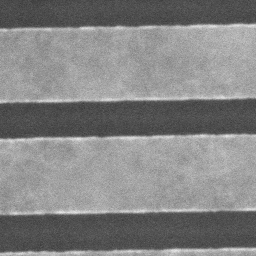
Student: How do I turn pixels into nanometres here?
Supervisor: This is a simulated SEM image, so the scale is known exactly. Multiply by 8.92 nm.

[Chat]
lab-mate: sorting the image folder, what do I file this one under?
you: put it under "lines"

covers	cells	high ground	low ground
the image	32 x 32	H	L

LLLLLLLLLLLLLLLLLLLLLLLLLLLLLLLL
LLLLLLLLLLLLLLLLLLLLLLLLLLLLLLLL
LLLLLLLLLLLLLLLLLLLLLLLLLLLLLLLL
LLLLLLLLHLHHHHHHHHHHHHHHHHHHHHHH
HHHHHHHHHHHHHHHHHHHHHHHHHHHHHHHH
HHHHHHHHHHHHHHHHHHHHHHHHHHHHHHHH
HHHHHHHHHHHHHHHHHHHHHHHHHHHHHHHH
HHHHHHHHHHHHHHHHHHHHHHHHHHHHHHHH
HHHHHHHHHHHHHHHHHHHHHHHHHHHHHHHH
HHHHHHHHHHHHHHHHHHHHHHHHHHHHHHHH
HHHHHHHHHHHHHHHHHHHHHHHHHHHHHHHH
HHHHHHHHHHHHHHHHHHHHHHHHHHHHHHHH
HHHHHHHHHHHHHHHHLLLLLLLLLLLLLLLL
LLLLLLLLLLLLLLLLLLLLLLLLLLLLLLLL
LLLLLLLLLLLLLLLLLLLLLLLLLLLLLLLL
LLLLLLLLLLLLLLLLLLLLLLLLLLLLLLLL
LLLLLLLLLLLLLLLLLLLLLLLLLLLLLLLL
LHHHHHHHHHHHHHHHHHHHHHHHHHHHHHHH
HHHHHHHHHHHHHHHHHHHHHHHHHHHHHHHH
HHHHHHHHHHHHHHHHHHHHHHHHHHHHHHHH
HHHHHHHHHHHHHHHHHHHHHHHHHHHHHHHH
HHHHHHHHHHHHHHHHHHHHHHHHHHHHHHHH
HHHHHHHHHHHHHHHHHHHHHHHHHHHHHHHH
HHHHHHHHHHHHHHHHHHHHHHHHHHHHHHHH
HHHHHHHHHHHHHHHHHHHHHHHHHHHHHHHH
HHHHHHHHHHHHHHHHHHHHHHHHHHHHHHHH
HHHHHHHHHHHHHLLLLLLLLLLLLLLLLLLL
LLLLLLLLLLLLLLLLLLLLLLLLLLLLLLLL
LLLLLLLLLLLLLLLLLLLLLLLLLLLLLLLL
LLLLLLLLLLLLLLLLLLLLLLLLLLLLLLLL
LLLLLLLLLLLLLLLLLLLLLLLLLLLLLLLL
LLLHLHLLHHHHHHHHHHHHHHHHHHHHHHHH